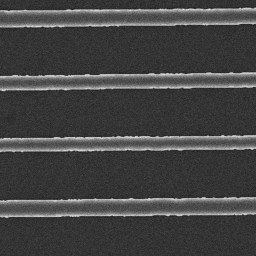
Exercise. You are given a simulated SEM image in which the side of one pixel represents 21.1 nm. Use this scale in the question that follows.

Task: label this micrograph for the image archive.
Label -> lines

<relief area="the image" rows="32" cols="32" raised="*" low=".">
................................
********************************
********************************
................................
................................
................................
................................
................................
................................
.**..***************************
********************************
................................
................................
................................
................................
................................
................................
********************************
********************************
................................
................................
................................
................................
................................
................................
********************************
********************************
................................
................................
................................
................................
................................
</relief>